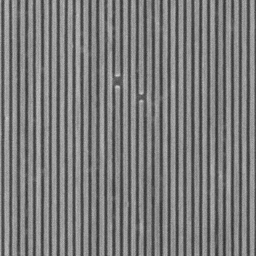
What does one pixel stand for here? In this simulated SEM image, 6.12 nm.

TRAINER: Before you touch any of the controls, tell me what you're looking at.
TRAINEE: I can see parallel lines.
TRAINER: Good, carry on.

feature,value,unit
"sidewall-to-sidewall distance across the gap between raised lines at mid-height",26.8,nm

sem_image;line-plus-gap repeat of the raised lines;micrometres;0.0485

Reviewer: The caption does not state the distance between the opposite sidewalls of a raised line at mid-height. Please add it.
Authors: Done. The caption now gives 22.2 nanometres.